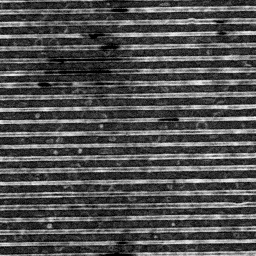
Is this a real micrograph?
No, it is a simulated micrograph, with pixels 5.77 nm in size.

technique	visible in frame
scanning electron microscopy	parallel lines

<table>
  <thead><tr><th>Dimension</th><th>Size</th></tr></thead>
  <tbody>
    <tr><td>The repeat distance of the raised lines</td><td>12.3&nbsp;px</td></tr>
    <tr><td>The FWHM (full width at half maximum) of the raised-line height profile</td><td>24.5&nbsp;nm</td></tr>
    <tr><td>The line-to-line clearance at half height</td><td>45.5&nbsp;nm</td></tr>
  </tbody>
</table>